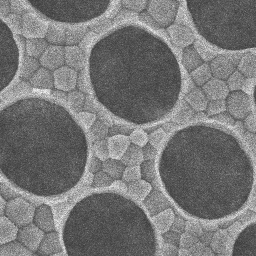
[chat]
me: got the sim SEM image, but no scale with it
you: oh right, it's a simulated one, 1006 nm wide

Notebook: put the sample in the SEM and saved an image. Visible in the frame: holes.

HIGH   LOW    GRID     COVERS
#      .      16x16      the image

##.....#####....
############....
.#####....###...
.#####.....#####
.#####.....#####
######.....#####
#...##.....#####
.....###..######
.....######....#
.....#####.....#
.....#####......
#....#####......
#####...###....#
####.....###..##
####......#####.
####......#####.